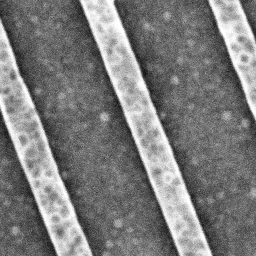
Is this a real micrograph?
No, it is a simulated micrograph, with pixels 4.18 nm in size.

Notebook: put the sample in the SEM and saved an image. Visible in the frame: one or a few lines or trenches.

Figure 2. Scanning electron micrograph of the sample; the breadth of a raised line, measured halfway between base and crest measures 119 nanometres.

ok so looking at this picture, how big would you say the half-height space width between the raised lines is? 353 nanometres